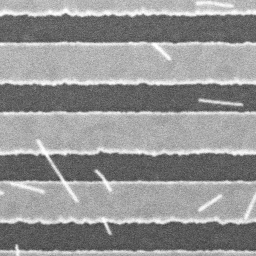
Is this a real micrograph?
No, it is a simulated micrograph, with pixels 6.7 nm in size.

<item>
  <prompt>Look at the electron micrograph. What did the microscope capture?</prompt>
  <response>lines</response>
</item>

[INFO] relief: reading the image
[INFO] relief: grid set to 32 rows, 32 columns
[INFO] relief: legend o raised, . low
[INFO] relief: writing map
oooooooooooooooooooooooooooooooo
oooooooooooooooooooooooooooooooo
................................
................................
................................
oooooooooooooooooooooooooooooooo
oooooooooooooooooooooooooooooooo
oooooooooooooooooooooooooooooooo
oooooooooooooooooooooooooooooooo
oooooooooooooooooooooooooooooooo
..o..oo...oo....o..ooo.....oo...
................................
................................
................................
oooooooooooooooooooooooooooooooo
oooooooooooooooooooooooooooooooo
oooooooooooooooooooooooooooooooo
oooooooooooooooooooooooooooooooo
oooooooooooooooooooooooooooooooo
................................
................................
................................
................................
oooooooooooooooooooooooooooooooo
oooooooooooooooooooooooooooooooo
oooooooooooooooooooooooooooooooo
oooooooooooooooooooooooooooooooo
oooooooooooooooooooooooooooooooo
................................
................................
................................
ooooo.oo.ooo.ooo.o.oooooooooooo.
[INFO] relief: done